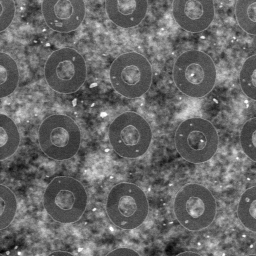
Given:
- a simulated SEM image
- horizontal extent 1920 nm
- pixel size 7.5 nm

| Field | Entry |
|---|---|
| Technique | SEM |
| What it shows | a regular array of ring-shaped raised bodies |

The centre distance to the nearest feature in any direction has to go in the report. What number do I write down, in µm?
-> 0.471